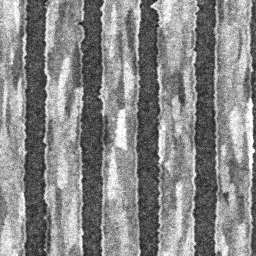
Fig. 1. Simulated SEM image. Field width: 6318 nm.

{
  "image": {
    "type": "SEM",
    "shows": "parallel lines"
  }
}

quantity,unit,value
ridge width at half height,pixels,34.5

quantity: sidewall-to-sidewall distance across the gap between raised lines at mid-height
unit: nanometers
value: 543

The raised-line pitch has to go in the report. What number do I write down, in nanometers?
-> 1400